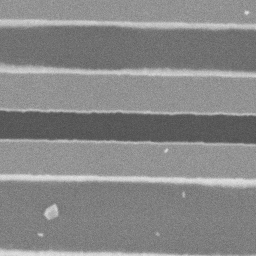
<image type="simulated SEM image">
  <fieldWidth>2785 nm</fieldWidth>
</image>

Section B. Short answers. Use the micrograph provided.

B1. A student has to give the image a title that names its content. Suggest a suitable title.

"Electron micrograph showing lines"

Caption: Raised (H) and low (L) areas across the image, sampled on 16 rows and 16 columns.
HHHHHHHHHHHHHHHH
LLLLLLLLLHHHHHHH
LLLLLLLLLLLLLLLL
LLLLLLLLLLLLLLLL
HHHHLLLLLLLLLLLL
HHHHHHHHHHHHHHHH
HHHHHHHHHHHHHHHH
LLLLLLLLLLLLLLLL
LLLLLLLLLLLLLLLL
HHHHHHHHHHHHHHHH
HHHHHHHHHHHHHHHH
LLLLLLLLLLLLLLLL
LLLLLLLLLLLLLLLL
LLLLLLLLLLLLLLLL
LLLLLLLLLLLLLLLL
LLLLLLLLLLLLLLLL